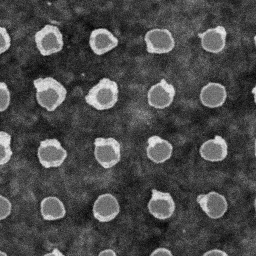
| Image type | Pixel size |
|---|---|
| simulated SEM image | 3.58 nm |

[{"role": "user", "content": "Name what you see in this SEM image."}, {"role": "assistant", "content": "a regular array of raised bodies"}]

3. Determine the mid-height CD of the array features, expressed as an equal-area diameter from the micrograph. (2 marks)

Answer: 26.4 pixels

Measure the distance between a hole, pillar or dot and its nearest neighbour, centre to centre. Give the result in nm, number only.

190